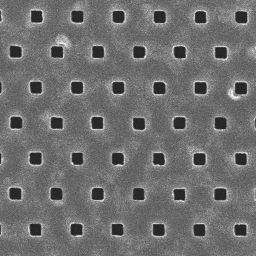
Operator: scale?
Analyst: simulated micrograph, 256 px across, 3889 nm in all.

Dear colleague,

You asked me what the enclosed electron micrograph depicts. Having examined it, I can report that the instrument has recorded a regular array of holes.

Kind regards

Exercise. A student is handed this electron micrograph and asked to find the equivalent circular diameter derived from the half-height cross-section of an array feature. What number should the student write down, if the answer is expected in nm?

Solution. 200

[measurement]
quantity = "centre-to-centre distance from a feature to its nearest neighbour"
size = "617 nm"